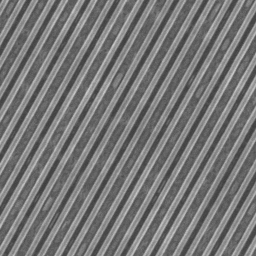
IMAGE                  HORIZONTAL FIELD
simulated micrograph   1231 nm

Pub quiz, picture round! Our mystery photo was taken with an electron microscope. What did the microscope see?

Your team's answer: parallel lines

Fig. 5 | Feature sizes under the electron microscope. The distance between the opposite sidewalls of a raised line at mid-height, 0.0249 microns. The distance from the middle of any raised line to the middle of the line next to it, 62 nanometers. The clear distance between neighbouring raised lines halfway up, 6.13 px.